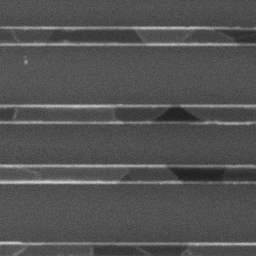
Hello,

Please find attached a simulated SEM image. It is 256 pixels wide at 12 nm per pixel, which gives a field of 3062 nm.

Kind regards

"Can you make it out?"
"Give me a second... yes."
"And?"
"lines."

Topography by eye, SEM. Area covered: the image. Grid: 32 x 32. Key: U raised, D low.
DDDDDDDDDDDDDDDDDDDDDDDDDDDDDDDD
DDDDDDDDDDDDDDDDDDDDDDDDDDDDDDDD
DDDDDDDDDDDDDDDDDDDDDDDDDDDDDDDD
UUUUUUUUUUUUUUUUUUUUUUUUUUUUUUDD
UUUUUUUUUUUUUUUUUUUUUUUUUUUUUUUU
UUUUUUUUUUUUUUUUUUUUUUUUUUUUUUUU
DDDDDDDDDDDDDDDDDDDDDDDDDDDDDDDD
DDDDDDDDDDDDDDDDDDDDDDDDDDDDDDDD
DDDDDDDDDDDDDDDDDDDDDDDDDDDDDDDD
DDDDDDDDDDDDDDDDDDDDDDDDDDDDDDDD
DDDDDDDDDDDDDDDDDDDDDDDDDDDDDDDD
DDDDDDDDDDDDDDDDDDDDDDDDDDDDDDDD
DDDDDDDDDDDDDDDDDDDDDDDDDDDDDDDD
UUUUUUUUUUUUUUUUUUUUUUUUUUUUUUUU
UUUUUUUUUUUUUUUUUUUUUUUUUUUUUUUU
DDDDDDDDDDDDDDDDDDDDDDDDDDDDDDDD
DDDDDDDDDDDDDDDDDDDDDDDDDDDDDDDD
DDDDDDDDDDDDDDDDDDDDDDDDDDDDDDDD
DDDDDDDDDDDDDDDDDDDDDDDDDDDDDDDD
DDDDDDDDDDDDDDDDDDDDDDDDDDDDDDDD
DDDDDDDDDDDDDDDDDDDDDDDDDDDDDDDD
UUUUUUUUUUUUUUUUUUUUUUUUUUUUUUUU
UUUUUUUUUUUUUUUUUUUUUUUUUUUUUUUU
DDDDDDDDDDDDDDDDDDDDDDDDDDDDDDDD
DDDDDDDDDDDDDDDDDDDDDDDDDDDDDDDD
DDDDDDDDDDDDDDDDDDDDDDDDDDDDDDDD
DDDDDDDDDDDDDDDDDDDDDDDDDDDDDDDD
DDDDDDDDDDDDDDDDDDDDDDDDDDDDDDDD
DDDDDDDDDDDDDDDDDDDDDDDDDDDDDDDD
DDDDDDDDDDDDDDDDDDDDDDDDDDDDDDDD
UUUUUUUUUUUUUUUUUUUUUUUUUUUUUUUU
UUUUUUUUUUUUUUUUUUUUUUUUUUUUUUUU